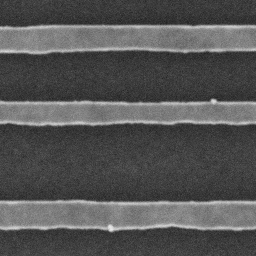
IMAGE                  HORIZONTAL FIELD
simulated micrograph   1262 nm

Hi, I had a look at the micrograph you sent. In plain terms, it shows lines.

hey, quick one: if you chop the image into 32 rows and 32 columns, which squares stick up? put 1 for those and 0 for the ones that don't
00000000000000000000000000000000
00000000000000000000000000000000
00000000000000000000000000000000
11111111111111111111111111111111
11111111111111111111111111111111
11111111111111111111111111111111
11111110000000000000001100000000
00000000000000000000000000000000
00000000000000000000000000000000
00000000000000000000000000000000
00000000000000000000000000000000
00000000000000000000000000000000
00000000000000000000000000000000
11111111111111111111111111111111
11111111111111111111111111111111
00111111111111000000110000001110
00000000000000000000000000000000
00000000000000000000000000000000
00000000000000000000000000000000
00000000000000000000000000000000
00000000000000000000000000000000
00000000000000000000000000000000
00000000000000000000000000000000
00000000000000000000000000000000
00000000000000000000000000000000
11111111111111111111111111111111
11111111111111111111111111111111
11111111111111111111111111111111
11111110111111111110000111111111
00000000000000000000000000000000
00000000000000000000000000000000
00000000000000000000000000000000